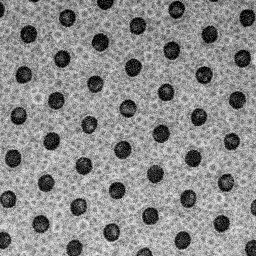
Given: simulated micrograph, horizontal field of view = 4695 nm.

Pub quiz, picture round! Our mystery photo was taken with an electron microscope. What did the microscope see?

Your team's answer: a regular array of holes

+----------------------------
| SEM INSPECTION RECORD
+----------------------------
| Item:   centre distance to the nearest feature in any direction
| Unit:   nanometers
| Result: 748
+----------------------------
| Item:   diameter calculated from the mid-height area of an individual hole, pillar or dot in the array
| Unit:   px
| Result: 18.1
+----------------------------